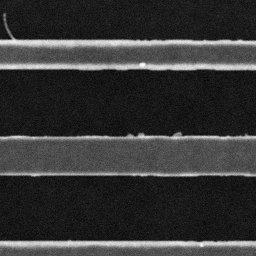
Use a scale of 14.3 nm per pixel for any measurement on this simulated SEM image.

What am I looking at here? lines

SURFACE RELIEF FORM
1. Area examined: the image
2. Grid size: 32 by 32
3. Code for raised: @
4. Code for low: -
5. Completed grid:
--------------------------------
--------------------------------
--------------------------------
--------------------------------
--------------------------------
@@@@@@@@@@@@@@@@@@@@@@@@@@@@@@@@
@@@@@@@@@@@@@@@@@@@@@@@@@@@@@@@@
@@@@@@@@@@@@@@@@@@@@@@@@@@@@@@@@
-@-------@@@@@@@@-@@@@@@@-@@@@@@
--------------------------------
--------------------------------
--------------------------------
--------------------------------
--------------------------------
--------------------------------
--------------------------------
--------------------------------
@@@@@@@@@@@@@@@@@@@@@@@@@@@@@@@@
@@@@@@@@@@@@@@@@@@@@@@@@@@@@@@@@
@@@@@@@@@@@@@@@@@@@@@@@@@@@@@@@@
@@@@@@@@@@@@@@@@@@@@@@@@@@@@@@@@
@@@@@@@@@@@@@@@@@@@@@@@@@@@@@@@@
--------------------------------
--------------------------------
--------------------------------
--------------------------------
--------------------------------
--------------------------------
--------------------------------
--------------------------------
@@@@@@@@@@@@@@@@@@@@@@@@@@@@@@@@
@@@@@@@@@@@@@@@@@@@@@@@@@@@@@@@@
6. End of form